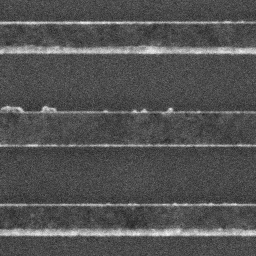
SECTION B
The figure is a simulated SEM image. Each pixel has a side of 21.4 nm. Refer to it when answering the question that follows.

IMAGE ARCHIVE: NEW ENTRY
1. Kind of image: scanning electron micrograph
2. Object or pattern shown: lines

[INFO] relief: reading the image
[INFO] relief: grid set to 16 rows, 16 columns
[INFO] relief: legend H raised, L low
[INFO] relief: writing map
LLLLLLLLLLLLLLLL
HHHHHHHHHHHHHHHH
HHHHHHHHHHHHHHHH
LLLLLLLLLLLLLLLL
LLLLLLLLLLLLLLLL
LLLLLLLLLLLLLLLL
LLLLLLLLLLLLLLLL
HHHHHHHHHHHHHHHH
HHHHHHHHHHHHHHHH
LLLLLLLLLLLLLLLL
LLLLLLLLLLLLLLLL
LLLLLLLLLLLLLLLL
LLLLLLLLLLLLLLLL
HHHHHHHHHHHHHHHH
HHHHHHHHHHHHHHHH
LLLLLLLLLLLLLLLL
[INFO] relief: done